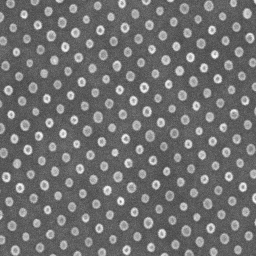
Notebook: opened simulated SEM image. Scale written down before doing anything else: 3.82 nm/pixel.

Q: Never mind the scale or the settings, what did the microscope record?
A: a regular array of raised bodies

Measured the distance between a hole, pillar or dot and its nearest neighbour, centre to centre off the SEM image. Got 65.3 nanometres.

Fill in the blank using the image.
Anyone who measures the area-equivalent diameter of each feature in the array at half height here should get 0.0308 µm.